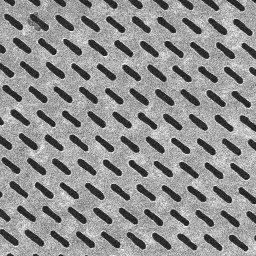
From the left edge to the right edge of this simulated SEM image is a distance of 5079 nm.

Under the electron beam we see a regular array of holes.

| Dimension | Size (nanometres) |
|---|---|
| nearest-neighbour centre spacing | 499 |